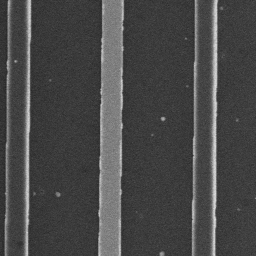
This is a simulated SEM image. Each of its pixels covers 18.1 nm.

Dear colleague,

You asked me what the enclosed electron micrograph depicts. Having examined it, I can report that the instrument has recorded lines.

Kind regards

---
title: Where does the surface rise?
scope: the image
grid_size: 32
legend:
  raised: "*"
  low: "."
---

.***.........**.........***.....
.***.........**.........***.....
.***.........**.........***.....
.***.........**.........***.....
.***.........**.........***.....
.***.........**.........***.....
.***.........**.........***.....
.***.........**.........***.....
.***.........**.........***.....
.***.........**.........***.....
.***.........**.........***.....
.***.........**.........***.....
.***.........**.........***.....
.***.........**.........***.....
.***.........**.........***.....
.***.........**.........***.....
.***.........**.........***.....
.***.........**.........***.....
.***.........**.........***.....
.***.........**.........***.....
.**..........**.........***.....
.**..........**.........***.....
.**..........**.........***.....
.**..........**.........***.....
.**..........**.........***.....
.**..........**.........***.....
.**..........**.........***.....
.**..........**.........***.....
.**..........**.........***.....
.**..........**.........***.....
.**.........***.........***.....
.**..........**.........***.....